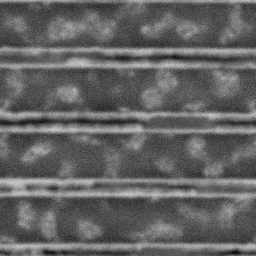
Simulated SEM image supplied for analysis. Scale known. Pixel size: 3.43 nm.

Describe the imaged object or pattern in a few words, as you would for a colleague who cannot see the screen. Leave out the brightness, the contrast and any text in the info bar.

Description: one or a few lines or trenches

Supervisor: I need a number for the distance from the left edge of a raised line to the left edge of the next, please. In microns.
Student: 0.222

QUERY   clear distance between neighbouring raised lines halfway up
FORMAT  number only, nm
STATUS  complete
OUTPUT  169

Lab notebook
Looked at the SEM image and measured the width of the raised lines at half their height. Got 56.1 nm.